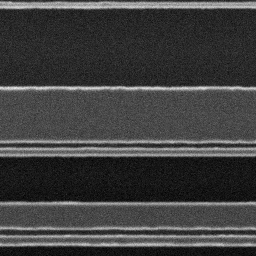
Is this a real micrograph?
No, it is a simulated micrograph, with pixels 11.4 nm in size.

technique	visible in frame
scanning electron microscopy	lines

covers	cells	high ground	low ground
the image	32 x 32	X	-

XXXXXXXXXXXXXXXXXXXXXXXXXXXXXXXX
--------------------------------
--------------------------------
--------------------------------
--------------------------------
--------------------------------
--------------------------------
--------------------------------
--------------------------------
--------------------------------
--------------------------------
XXXXXXXXXXXXXXXXXXXXXXXXXXXXXXXX
XXXXXXXXXXXXXXXXXXXXXXXXXXXXXXXX
XXXXXXXXXXXXXXXXXXXXXXXXXXXXXXXX
XXXXXXXXXXXXXXXXXXXXXXXXXXXXXXXX
XXXXXXXXXXXXXXXXXXXXXXXXXXXXXXXX
XXXXXXXXXXXXXXXXXXXXXXXXXXXXXXXX
XXXXXXXXXXXXXXXXXXXXXXXXXXXXXXXX
XXXXXXXXXXXXXXXXXXXXXXXXXXXXXXXX
--------------------------------
--------------------------------
--------------------------------
--------------------------------
--------------------------------
--------------------------------
XXXXXXXXXXXXXXXXXXXXXXXXXXXXXXXX
XXXXXXXXXXXXXXXXXXXXXXXXXXXXXXXX
XXXXXXXXXXXXXXXXXXXXXXXXXXXXXXXX
XXXXXXXXXXXXXXXXXXXXXXXXXXXXXXXX
XXXXXXXXXXXXXXXXXXXXXXXXXXXXXXXX
XXXXXXXXXXXXXXXXXXXXXXXXXXXXXXXX
--------------------------------